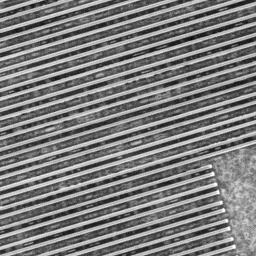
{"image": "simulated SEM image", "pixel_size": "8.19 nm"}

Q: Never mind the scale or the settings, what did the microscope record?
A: parallel lines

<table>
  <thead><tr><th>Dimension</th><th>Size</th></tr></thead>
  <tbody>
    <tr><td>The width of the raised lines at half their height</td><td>23.6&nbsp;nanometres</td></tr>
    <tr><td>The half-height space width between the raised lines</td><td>5.75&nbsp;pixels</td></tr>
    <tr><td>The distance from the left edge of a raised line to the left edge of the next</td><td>77.4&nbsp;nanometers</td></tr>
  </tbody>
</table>